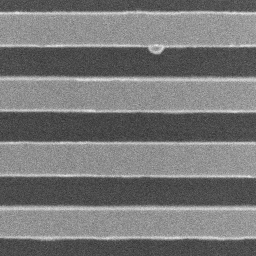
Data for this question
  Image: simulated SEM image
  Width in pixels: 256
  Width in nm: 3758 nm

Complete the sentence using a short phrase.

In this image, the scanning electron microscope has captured lines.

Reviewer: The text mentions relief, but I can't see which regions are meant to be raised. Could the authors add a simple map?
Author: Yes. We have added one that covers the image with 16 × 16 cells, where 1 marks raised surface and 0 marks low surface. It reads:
0000000000000000
1111111111111111
1111111111111111
0000000000000000
0000000000000000
1111111111111111
1111111111111111
0000000000000000
0000000000000000
1111111111111111
1111111111111111
0000000000000000
0000000000000000
1111111111111111
1111111111111111
0000000000000000